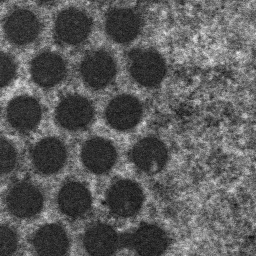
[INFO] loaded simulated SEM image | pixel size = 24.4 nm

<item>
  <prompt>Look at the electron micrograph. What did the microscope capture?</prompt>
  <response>a regular array of raised bodies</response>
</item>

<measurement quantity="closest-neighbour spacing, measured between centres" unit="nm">1210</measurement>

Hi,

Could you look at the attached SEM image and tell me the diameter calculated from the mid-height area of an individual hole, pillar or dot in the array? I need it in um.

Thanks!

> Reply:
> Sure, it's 0.891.